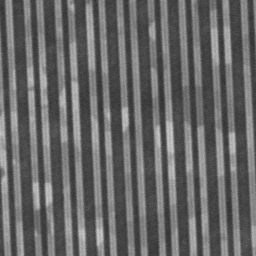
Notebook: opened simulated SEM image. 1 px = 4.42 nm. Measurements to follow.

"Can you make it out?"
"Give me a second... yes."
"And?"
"parallel lines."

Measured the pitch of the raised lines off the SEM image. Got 68.6 nm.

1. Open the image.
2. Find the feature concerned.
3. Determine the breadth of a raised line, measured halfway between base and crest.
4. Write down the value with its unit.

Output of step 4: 0.021 micrometres